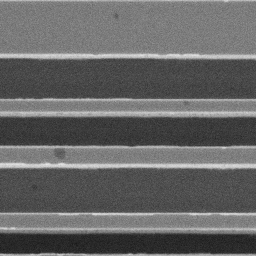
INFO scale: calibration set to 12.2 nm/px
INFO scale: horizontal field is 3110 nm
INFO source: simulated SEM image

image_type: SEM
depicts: lines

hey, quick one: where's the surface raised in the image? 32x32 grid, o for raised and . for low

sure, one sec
oooooooooooooooooooooooooooooooo
oooooooooooooooooooooooooooooooo
oooooooooooooooooooooooooooooooo
oooooooooooooooooooooooooooooooo
oooooooooooooooooooooooooooooooo
oooooooooooooooooooooooooooooooo
oooooooooooooooooooooooooooooooo
................................
................................
................................
................................
................................
oooooooooooooooooooooooooooooooo
oooooooooooooooooooooooooooooooo
................................
................................
................................
................................
oooooooooooooooooooooooooooooooo
oooooooooooooooooooooooooooooooo
oooooooooooooooooooooooooooooooo
................................
................................
................................
................................
................................
................................
oooooooooooooooooooooooooooooooo
oooooooooooooooooooooooooooooooo
................................
................................
................................